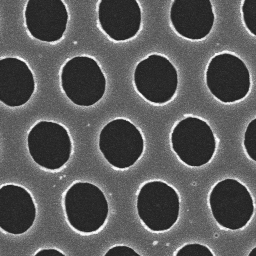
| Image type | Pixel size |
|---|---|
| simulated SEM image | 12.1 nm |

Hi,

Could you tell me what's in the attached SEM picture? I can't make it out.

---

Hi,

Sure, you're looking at a regular array of holes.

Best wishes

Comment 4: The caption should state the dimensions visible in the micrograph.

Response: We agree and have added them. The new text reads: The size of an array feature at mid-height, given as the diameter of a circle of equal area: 557 nanometers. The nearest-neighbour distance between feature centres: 869 nanometres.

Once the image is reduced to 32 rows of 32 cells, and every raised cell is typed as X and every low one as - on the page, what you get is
XXX-----XXXXX----XXXXX----XXXX--
XXX-----XXXX------XXX------XXX--
XXX-----XXXX------XXX------XXXX-
XXX-----XXXXX----XXXXX----XXXXX-
XXXX----XXXXXX---XXXXXX---XXXXXX
XXXXXXXXXXXXXXXXXXXXXXXXXXXXXXXX
XXXXXXXXXXXXXXXXXXXXXXXXXXXXXXXX
---XXXXXX---XXXXXX---XXXXX----XX
----XXXX----XXXXX-----XXXX-----X
----XXXX-----XXXX-----XXXX-----X
----XXXX-----XXXX-----XXXX-----X
----XXXX-----XXXX-----XXXX-----X
----XXXXX---XXXXXXX--XXXXXX---XX
XXXXXXXXXXXXXXXXXXXXXXXXXXXXXXXX
XXXXXXXXXXXXXXXXXXXXXXXXXXXXXXXX
XXXXX--XXXXXX----XXXXX----XXXXX-
XXXX----XXXXX----XXXXX-----XXXX-
XXX------XXX------XXX------XXX--
XXXX-----XXX------XXXX-----XXXX-
XXXX-----XXXX----XXXXX----XXXXX-
XXXXX---XXXXXX---XXXXXX--XXXXXXX
XXXXXXXXXXXXXXXXXXXXXXXXXXXXXXXX
XXXXXXXXXXXXXXXXXXXXXXXXXXXX-XXX
---XXXXXX---XXXXXX---XXXXXX----X
----XXXX-----XXXX-----XXXX-----X
----XXXX-----XXXX-----XXXX------
-----XXX------XXX-----XXXX------
----XXXXX----XXXXX----XXXXX----X
----XXXXX---XXXXXXX--XXXXXXX--XX
XXXXXXXXXXXXXXXXXXXXXXXXXXXXXXXX
XXXXXXXXXXXXXXXXXXXXXXXXXXXXXXXX
XXXXX--XXXXXX----XXXXX----XXXXX-